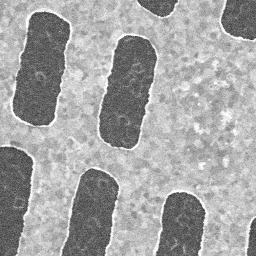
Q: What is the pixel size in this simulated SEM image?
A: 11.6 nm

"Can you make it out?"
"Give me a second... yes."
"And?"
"holes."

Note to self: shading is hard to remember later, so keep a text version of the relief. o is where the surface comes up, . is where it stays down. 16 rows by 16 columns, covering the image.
ooooooooo..ooo..
oo..oooooooooo..
oo..ooo..ooooooo
o...ooo...oooooo
o...ooo...oooooo
o...ooo..ooooooo
o...oo...ooooooo
o..ooo...ooooooo
oooooo...ooooooo
.ooooooooooooooo
..oooooooooooooo
..ooo..ooooooooo
..ooo..ooo..oooo
..oo...ooo...ooo
.ooo...ooo...ooo
.ooo...ooo...oo.